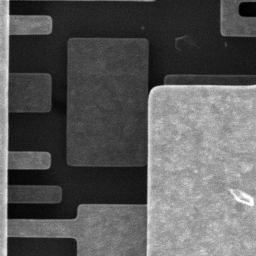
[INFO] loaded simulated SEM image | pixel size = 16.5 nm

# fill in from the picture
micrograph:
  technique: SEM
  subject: wiring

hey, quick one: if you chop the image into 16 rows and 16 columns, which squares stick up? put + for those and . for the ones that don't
+...............
+...............
+...............
+...............
+...............
..........++++++
.........+++++++
.........+++++++
.........+++++++
.........+++++++
.........+++++++
.........+++++++
.........+++++++
.........+++++++
.........+++++++
.........+++++++